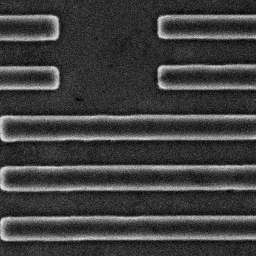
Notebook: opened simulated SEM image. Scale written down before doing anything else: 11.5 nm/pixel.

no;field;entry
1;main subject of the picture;wiring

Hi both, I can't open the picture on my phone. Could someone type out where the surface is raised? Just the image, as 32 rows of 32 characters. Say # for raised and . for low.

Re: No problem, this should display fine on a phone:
................................
................................
#######.............############
#######.............############
#######.............############
................................
................................
................................
#######.............############
#######.............############
#######.............############
................................
................................
................................
................................
################################
################################
.#..............................
................................
................................
................................
################################
################################
.###############################
................................
................................
................................
.###############################
################################
################################
................................
................................